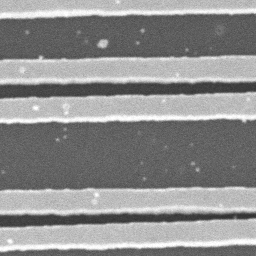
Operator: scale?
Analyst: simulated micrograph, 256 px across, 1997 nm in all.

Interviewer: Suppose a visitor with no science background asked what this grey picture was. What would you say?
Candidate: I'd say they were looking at lines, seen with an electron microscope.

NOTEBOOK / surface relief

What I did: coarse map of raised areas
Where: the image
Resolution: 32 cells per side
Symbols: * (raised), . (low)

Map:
********************************
*******************************.
................................
................................
................................
................................
................................
.......**.**********************
********************************
********************************
................................
................................
********************************
********************************
********************************
................................
................................
................................
................................
................................
................................
................................
................................
........................*...***.
********************************
********************************
***************..*..............
...............................*
********************************
********************************
****************************....
................................